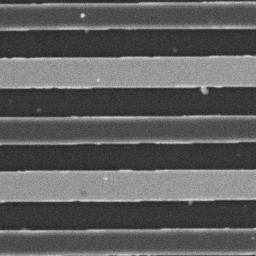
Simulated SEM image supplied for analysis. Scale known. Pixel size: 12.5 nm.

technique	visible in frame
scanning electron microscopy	lines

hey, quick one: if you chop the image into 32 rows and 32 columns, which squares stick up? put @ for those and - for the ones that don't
-----@@@@@@@@@@@@@@@@@@@@@@@@@@@
@@@@@@@@@@@@@@@@@@@@@@@@@@@@@@@@
@@@@@@@@@@@@@@@@@@@@@@@@@@@@@@@@
@@@@@@@@@@@@@@@@@@@@@@@@@@@@@@@@
--------------------------------
--------------------------------
--------------------------------
@@@@@@@@@@@@@@@@@@@@@@@@@@@@@@@@
@@@@@@@@@@@@@@@@@@@@@@@@@@@@@@@@
@@@@@@@@@@@@@@@@@@@@@@@@@@@@@@@@
@@@@@@@@@@@@@@@@@@@@@@@@@@@@@@@@
--------------------------------
--------------------------------
--------------------------------
--------------------------------
@@@@@@@@@@@@@@@@@@@@@@@@@@@@@@@@
@@@@@@@@@@@@@@@@@@@@@@@@@@@@@@@@
@@@@@@@@@@@@@@@@@@@@@@@@@@@@@@@@
--------------------------------
--------------------------------
--------------------------------
--@@@@@@@@@@@@@@@@@@@@@@@@@@@@@@
@@@@@@@@@@@@@@@@@@@@@@@@@@@@@@@@
@@@@@@@@@@@@@@@@@@@@@@@@@@@@@@@@
@@@@@@@@@@@@@@@@@@@@@@@@@@@@@@@@
--------------------------------
--------------------------------
--------------------------------
--------------------------------
@@@@@@@@@@@@@@@@@@@@@@@@@@@@@@@@
@@@@@@@@@@@@@@@@@@@@@@@@@@@@@@@@
@@@@@@@@@@@@@@@@@@@@@@@@@@@@@@@@